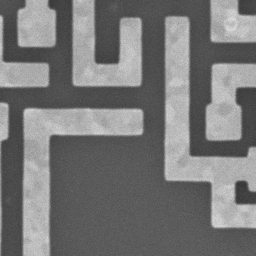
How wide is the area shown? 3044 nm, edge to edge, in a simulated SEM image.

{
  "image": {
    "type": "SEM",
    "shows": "wiring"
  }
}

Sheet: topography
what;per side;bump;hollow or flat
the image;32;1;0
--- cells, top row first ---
00011100011100000000000000111100
00111110011100000000000000111100
00111110011100011000011000111111
00111110011100011100011100111111
00111110011100011100011100111111
00111110011100011100011100000000
00000000011100011100011100000000
00000000011100011100011100000000
11111100011111111100011100011111
11111100011111111100011100011111
11111100011111111000011100011111
00000000000000000000011100011100
00000000000000000000011100111000
10000000000000000000011000111100
10011111111111111100011000111100
10011111111111111100011100111100
10011111111111111100011100111100
00011100000000000000011100110000
00011100000000000000011100000001
00011100000000000000011100000001
00011100000000000000011111111111
00011100000000000000011111111111
00011100000000000000000011111111
00011100000000000000000000011001
00011100000000000000000000011000
00011100000000000000000000011100
00011100000000000000000000011111
00011100000000000000000000011111
00011100000000000000000000000000
00011100000000000000000000000000
00011100000000000000000000000000
00011100000000000000000000000000